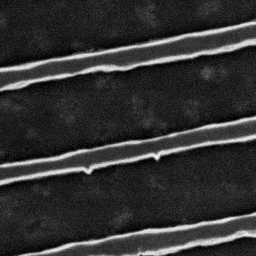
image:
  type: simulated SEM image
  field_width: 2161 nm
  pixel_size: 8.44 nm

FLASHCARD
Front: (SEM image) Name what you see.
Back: one or a few lines or trenches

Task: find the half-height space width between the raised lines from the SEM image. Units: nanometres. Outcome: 637